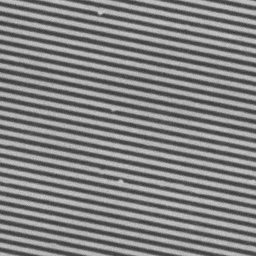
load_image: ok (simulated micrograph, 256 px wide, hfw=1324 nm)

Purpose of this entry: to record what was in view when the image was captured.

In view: parallel lines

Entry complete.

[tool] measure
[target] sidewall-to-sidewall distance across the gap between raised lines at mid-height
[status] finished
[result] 26 nanometres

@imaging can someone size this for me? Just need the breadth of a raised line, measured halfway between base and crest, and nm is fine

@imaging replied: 21.6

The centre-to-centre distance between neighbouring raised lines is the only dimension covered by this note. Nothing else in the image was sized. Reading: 0.0479 micrometres